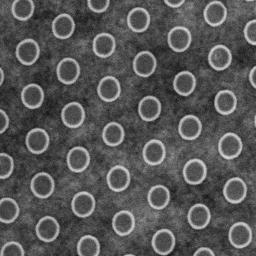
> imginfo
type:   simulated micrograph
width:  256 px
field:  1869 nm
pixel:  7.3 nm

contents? a regular array of raised bodies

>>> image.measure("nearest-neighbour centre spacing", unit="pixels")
43.6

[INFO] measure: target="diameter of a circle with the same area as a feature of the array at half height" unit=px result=22.7